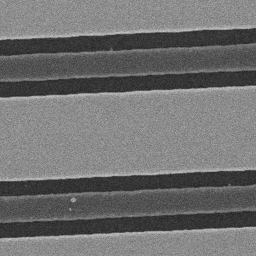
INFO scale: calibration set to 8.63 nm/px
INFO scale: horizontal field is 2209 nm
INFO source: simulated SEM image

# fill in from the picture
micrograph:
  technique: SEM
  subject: lines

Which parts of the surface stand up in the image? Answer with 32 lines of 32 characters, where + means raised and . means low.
++++++++++++++++++++++++++++++++
++++++++++++++++++++++++++++++++
++++++++++++++++++++++++++++++++
++++++++++++++++++++++++++++++++
+++++++++.......................
................................
.............+++++++++++++++++++
++++++++++++++++++++++++++++++++
++++++++++++++++++++++++++++++++
+++++++++++++...................
................................
.................+++++++++++++++
++++++++++++++++++++++++++++++++
++++++++++++++++++++++++++++++++
++++++++++++++++++++++++++++++++
++++++++++++++++++++++++++++++++
++++++++++++++++++++++++++++++++
++++++++++++++++++++++++++++++++
++++++++++++++++++++++++++++++++
++++++++++++++++++++++++++++++++
++++++++++++++++++++++++++++++++
+++++++++++++++++++++++++.......
+++.............................
..........................++++++
...+++++++++++++++++++++++++++++
++++++++++++++++++++++++++++++++
++++++++++++++++++++++++++++....
+++++++.........................
..............................++
.......+++++++++++++++++++++++++
++++++++++++++++++++++++++++++++
++++++++++++++++++++++++++++++++